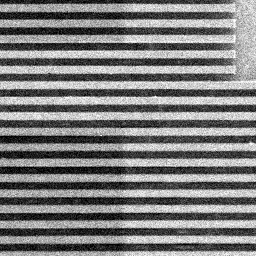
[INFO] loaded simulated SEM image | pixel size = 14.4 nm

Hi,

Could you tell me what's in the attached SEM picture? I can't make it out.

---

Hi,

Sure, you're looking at parallel lines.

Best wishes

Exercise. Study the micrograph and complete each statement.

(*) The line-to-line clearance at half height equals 112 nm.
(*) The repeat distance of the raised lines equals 223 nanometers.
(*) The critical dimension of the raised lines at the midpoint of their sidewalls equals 110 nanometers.